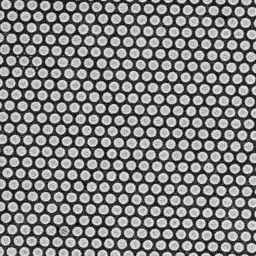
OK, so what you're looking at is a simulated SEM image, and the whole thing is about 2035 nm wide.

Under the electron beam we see a regular array of raised bodies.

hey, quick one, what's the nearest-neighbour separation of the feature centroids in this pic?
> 12.7 px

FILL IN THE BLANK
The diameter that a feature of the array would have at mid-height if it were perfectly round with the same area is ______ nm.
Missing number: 76.1